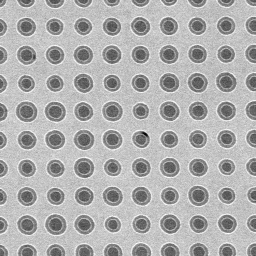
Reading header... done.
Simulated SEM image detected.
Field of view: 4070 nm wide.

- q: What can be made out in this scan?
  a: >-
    a regular array of ring-shaped grooves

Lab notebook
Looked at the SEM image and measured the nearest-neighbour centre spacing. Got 28.1 px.